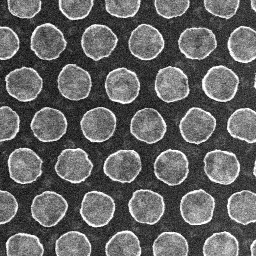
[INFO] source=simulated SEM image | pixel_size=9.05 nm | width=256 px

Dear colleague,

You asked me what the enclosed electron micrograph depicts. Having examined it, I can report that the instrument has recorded a regular array of raised bodies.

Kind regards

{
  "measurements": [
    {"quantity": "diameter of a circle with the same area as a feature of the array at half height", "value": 0.311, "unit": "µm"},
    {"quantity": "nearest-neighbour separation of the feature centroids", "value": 428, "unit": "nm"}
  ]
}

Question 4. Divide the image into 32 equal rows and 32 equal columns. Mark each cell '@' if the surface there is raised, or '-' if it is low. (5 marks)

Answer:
-@@@@---@@@@-@@@@--@@@@@--@@@@-@
-@@@@---@@@---@@@---@@@---@@@---
--------------------------------
@----@@----@@@---@@-----@-----@-
@@--@@@@--@@@@--@@@@---@@@@--@@@
@@--@@@@--@@@@--@@@@--@@@@@--@@@
@@--@@@@---@@@--@@@@---@@@---@@@
------------------------------@-
--------@@-----------@-----@----
-@@@@--@@@@---@@@---@@@---@@@---
-@@@@--@@@@--@@@@---@@@@--@@@@--
-@@@@---@@@--@@@@---@@@@--@@@---
--@@-----@----@@@---@@-----@@---
@-----------@-------------------
@@--@@@@---@@@---@@@---@@@---@@@
@@--@@@@--@@@@--@@@@@--@@@@--@@@
@@--@@@@--@@@@--@@@@@--@@@@--@@@
@----@@----@@-----@@---@@@-----@
--------------------------------
-@@@@--@@@@---@@@---@@@---@@@---
-@@@@--@@@@--@@@@@-@@@@---@@@@--
-@@@@--@@@@--@@@@--@@@@---@@@@--
--@@----@@----@@@---@@@----@@---
--------------------------------
@@---@@----@@----@@@---@@@---@@@
@@--@@@@--@@@@--@@@@---@@@@--@@@
@@--@@@@--@@@@--@@@@---@@@@--@@@
@----@@----@@@---@@@---@@@---@@@
--------------------------------
--@@----@@@---@@@---@@@---@@@---
-@@@@--@@@@--@@@@--@@@@---@@@@--
-@@@@--@@@@--@@@@--@@@@--@@@@@-@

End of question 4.